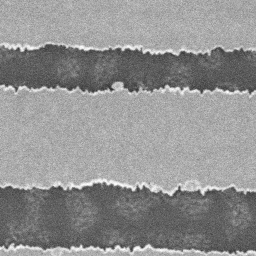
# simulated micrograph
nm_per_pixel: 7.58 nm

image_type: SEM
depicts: one or a few lines or trenches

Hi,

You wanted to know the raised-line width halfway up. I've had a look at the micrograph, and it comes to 744 nanometers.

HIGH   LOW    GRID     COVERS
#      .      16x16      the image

################
################
################
................
................
#......#........
################
################
################
################
################
######.#########
................
................
................
##...#..........